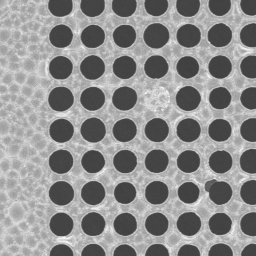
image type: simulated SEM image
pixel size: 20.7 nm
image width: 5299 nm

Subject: a regular array of holes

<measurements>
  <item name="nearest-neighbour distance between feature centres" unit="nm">643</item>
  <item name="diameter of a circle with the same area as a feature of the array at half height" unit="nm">500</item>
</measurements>